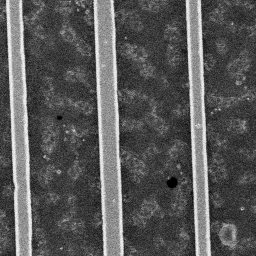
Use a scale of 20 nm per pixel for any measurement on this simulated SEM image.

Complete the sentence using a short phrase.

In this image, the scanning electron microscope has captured one or a few lines or trenches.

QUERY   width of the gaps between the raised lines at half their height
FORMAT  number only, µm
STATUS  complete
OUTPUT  1.48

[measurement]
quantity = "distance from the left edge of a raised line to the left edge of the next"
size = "1780 nm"